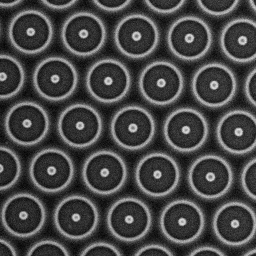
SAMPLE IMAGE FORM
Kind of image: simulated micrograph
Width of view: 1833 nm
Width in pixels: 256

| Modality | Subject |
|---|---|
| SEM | an array of small figures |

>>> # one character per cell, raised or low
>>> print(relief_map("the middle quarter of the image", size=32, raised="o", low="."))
.ooooooo......oooooooo.....ooooo
..ooooo........oooooo.......oooo
...oooo.........oooo.........ooo
...ooo..........oooo.........ooo
...ooo....oo....ooo.....o....ooo
..oooo..........ooo.....o....ooo
..ooooo........ooooo.........ooo
.oooooo........ooooo........oooo
ooooooooo.....ooooooo......ooooo
ooooooooooooooooooooooo...oooooo
oooo.ooooooooooooooooooooooooooo
o......oooooooo....ooooooooooo.o
........oooooo.......ooooooo....
.........oooo........oooooo.....
.........ooo..........oooo......
...oo....ooo.....o....oooo......
.........ooo.....o....ooo.....o.
........ooooo.........oooo......
........ooooo........ooooo......
o......ooooooo.......ooooo......
ooooooooooooooo....ooooooooo....
oooooooooooooooooooooooooooooooo
ooooooooo...oooooooooooooooooooo
.oooooo......oooooooo.....oooooo
.ooooo........oooooo.......ooooo
..oooo.........oooo.........oooo
..ooo..........oooo.........oooo
..ooo....oo....ooo.....o....oooo
.oooo..........oooo.........oooo
.ooooo.........oooo.........oooo
ooooooo.......ooooo........ooooo
oooooooo.....ooooooo......oooooo